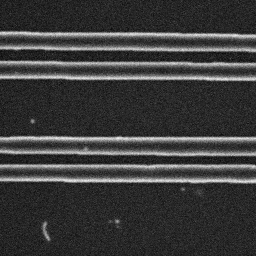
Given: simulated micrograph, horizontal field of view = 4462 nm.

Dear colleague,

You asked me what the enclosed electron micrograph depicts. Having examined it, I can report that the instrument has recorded lines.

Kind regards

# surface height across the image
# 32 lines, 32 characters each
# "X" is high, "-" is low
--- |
--------------------------------
--------------------------------
--------------------------------
--------------------------------
XXXXXXXXXXXXXXXXXXXXXXXXXXXXXXXX
XXXXXXXXXXXXXXXXXXXXXXXXXXXXXXXX
--------------------------------
--------------------------------
XXXXXXXXXXXXXXXXXXXXXXXXXXXXXXXX
XXXXXXXXXXXXXXXXXXXXXXXXXXXXXXXX
--------------------------------
--------------------------------
--------------------------------
--------------------------------
--------------------------------
--------------------------------
--------------------------------
XXXXXXXXXXXXXXXXXXXXXXXXXXXXXXXX
XXXXXXXXXXXXXXXXXXXXXXXXXXXXXXXX
--------------------------------
--------------------------------
XXXXXXXXXXXXXXXXXXXXXXXXXXXXXXXX
XXXXXXXXXXXXXXXXXXXXXXXXXXXXXXXX
--------------------------------
--------------------------------
--------------------------------
--------------------------------
--------------------------------
--------------------------------
--------------------------------
--------------------------------
--------------------------------